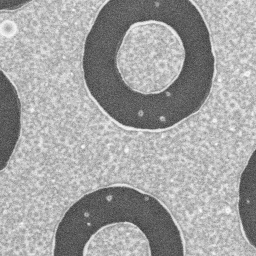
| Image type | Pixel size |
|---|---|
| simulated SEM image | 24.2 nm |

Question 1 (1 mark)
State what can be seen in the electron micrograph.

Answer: ring-shaped grooves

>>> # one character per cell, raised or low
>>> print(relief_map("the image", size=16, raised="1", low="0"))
0111110000001111
1111110001000111
1111100011100111
1111100111110111
1111100111100111
0111100011000111
0111110000000111
0111111000011111
0111111111111111
0111111111111111
1111111111111110
1111111111111110
1111100000111110
1111000000011110
1110001110011110
1110011110001111